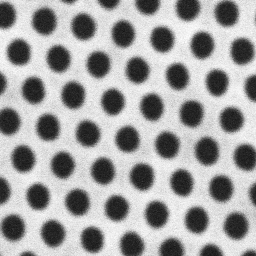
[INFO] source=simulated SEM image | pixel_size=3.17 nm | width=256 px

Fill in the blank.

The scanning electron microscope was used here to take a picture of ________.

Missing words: a regular array of holes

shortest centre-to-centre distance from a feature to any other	0.126	micrometres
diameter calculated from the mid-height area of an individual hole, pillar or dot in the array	83.7	nanometers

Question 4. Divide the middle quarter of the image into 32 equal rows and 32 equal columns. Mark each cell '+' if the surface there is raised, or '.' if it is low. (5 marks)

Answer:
.+++++......+++......+++++....++
.+++++.....++++.......++++.....+
++++++.....++++......++++......+
++++++++.+++++++.....++++......+
+..++++++++++++++...++++++.....+
.....+++++++++++++++++++++.....+
.....++++++...++++++++++++++..++
.....+++++.....++++++..+++++++++
.....++++......++++.....++++++++
.....++++......++++......+++++..
....+++++......++++......++++...
++++++++++.....++++......++++...
+++++++++++...+++++......++++...
++++++++++++++++++++....+++++...
++++....+++++++++++++++++++++...
+++.....+++++++..++++++++++++++.
+++......++++.....++++++++++++++
+++......++++......+++++....++++
+++......++++......++++......+++
++++.....++++......++++......+++
+++++...+++++......++++......+++
++++++++++++++....+++++......+++
..+++++++++++++++++++++.....++++
..++++++...+++++++++++++...+++++
...++++.....++++++++++++++++++++
...++++......+++++....++++++++++
...++++......++++.....++++++..++
..+++++......+++.......++++.....
.++++++......+++.......+++......
++++++++....++++......++++......
+++++++++++++++++.....++++......
++...+++++++++++++...++++++.....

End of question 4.